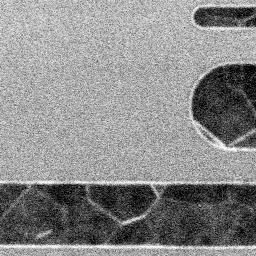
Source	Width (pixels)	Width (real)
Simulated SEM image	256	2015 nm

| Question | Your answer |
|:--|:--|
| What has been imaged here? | groups of lines, slits or small figures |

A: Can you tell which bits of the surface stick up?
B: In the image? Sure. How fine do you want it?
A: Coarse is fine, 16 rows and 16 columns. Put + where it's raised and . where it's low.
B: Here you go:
............++++
............++++
................
................
.............+++
............++++
............++++
............++++
.............+++
................
................
++++++++++++++++
++++++++++++++++
++++++++++++++++
++++++++++++++++
................